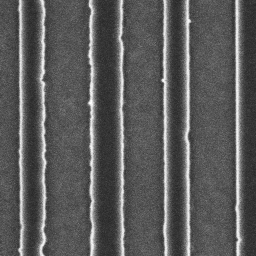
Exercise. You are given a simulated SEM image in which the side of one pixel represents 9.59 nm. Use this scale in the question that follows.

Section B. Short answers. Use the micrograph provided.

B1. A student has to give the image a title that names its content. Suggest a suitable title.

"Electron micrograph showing one or a few lines or trenches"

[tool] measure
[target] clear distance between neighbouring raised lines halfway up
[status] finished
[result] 46.8 pixels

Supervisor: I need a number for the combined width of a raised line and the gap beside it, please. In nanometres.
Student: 693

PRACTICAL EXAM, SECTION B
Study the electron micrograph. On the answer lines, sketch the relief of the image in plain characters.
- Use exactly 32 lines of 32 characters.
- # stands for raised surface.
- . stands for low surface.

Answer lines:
...##......####......##.......##
..####.....####......##.......##
...##......####......###......##
...##......####......##.......##
...##......####......##.......##
...##......####......##.......##
...##......####......##.......##
...##......####......##.......##
...##......####......##.......##
...##......####......###......##
...##......####......###......##
...##......####......##.......##
...##......####......##.......##
...##......####......##.......##
...###.....####......##.......##
...##......####......##.......##
...###.....####......##.......##
...###.....####......##.......##
...###.....####......##.......##
...###.....####......##.......##
...###.....####......###......##
...###.....####......###......##
...##......####......###......##
...###.....####......###......##
...###.....####......###......##
...###.....####......###......##
...###.....####......###......##
...###.....####......###......##
...##......####......###......##
...###.....####......###......##
...##......####......###......##
...##......####......###......##